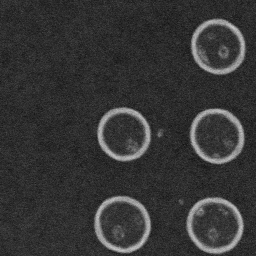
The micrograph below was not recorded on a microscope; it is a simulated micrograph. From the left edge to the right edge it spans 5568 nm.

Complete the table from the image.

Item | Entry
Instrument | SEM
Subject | raised bodies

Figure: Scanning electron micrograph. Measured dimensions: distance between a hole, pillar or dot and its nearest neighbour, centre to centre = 1.94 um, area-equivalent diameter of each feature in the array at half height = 1070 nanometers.